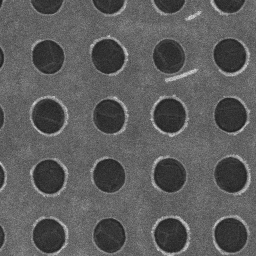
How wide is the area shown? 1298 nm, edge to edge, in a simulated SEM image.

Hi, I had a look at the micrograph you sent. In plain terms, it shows a regular array of holes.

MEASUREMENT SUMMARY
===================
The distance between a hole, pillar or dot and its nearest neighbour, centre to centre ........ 302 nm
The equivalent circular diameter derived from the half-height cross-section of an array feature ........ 172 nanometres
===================